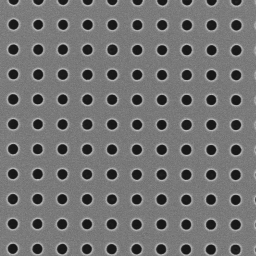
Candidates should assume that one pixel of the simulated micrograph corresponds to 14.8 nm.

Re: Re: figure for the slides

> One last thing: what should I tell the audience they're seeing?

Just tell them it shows a regular array of holes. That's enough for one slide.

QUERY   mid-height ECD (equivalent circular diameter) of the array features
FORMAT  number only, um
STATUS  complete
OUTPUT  0.153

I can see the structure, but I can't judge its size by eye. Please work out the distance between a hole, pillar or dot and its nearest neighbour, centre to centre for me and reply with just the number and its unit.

365 nm